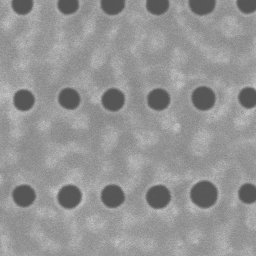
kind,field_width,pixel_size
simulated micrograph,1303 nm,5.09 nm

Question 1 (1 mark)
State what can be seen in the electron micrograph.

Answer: a regular array of holes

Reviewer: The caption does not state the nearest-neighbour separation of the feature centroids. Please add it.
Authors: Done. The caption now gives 229 nanometres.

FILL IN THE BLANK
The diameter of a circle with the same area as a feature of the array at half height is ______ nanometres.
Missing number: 121